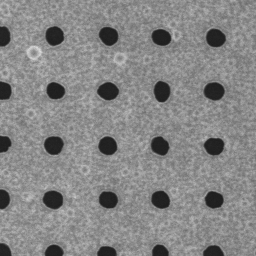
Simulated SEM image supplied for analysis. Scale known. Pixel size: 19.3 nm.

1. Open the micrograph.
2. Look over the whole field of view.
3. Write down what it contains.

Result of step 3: a regular array of holes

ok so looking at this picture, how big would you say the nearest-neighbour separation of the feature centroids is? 1020 nm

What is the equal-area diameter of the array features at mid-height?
368 nm